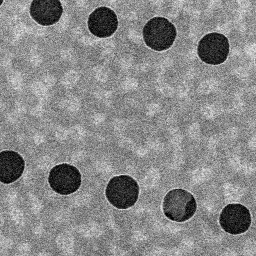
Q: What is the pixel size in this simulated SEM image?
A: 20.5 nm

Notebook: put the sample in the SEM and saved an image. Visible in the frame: holes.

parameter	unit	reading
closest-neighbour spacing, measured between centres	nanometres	1180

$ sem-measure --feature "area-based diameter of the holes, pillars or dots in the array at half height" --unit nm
676